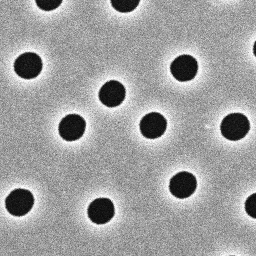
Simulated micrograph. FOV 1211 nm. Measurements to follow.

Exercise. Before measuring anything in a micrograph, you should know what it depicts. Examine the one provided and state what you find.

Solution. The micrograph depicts a regular array of holes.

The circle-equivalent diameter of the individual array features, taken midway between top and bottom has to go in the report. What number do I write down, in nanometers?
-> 131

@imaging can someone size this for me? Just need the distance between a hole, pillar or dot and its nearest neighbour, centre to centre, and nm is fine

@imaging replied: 314